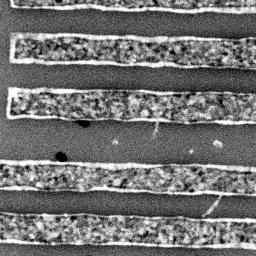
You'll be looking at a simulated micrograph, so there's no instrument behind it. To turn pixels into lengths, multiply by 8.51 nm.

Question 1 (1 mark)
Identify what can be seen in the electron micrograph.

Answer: groups of lines, slits or small figures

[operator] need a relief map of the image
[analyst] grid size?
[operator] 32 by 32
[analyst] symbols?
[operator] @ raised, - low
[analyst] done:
--@@@@@@@@@@@@@@@@@@@@@@@@@@@@@@
--------------------------------
--------------------------------
--------------------------------
-------@@@----------------------
--@@@@@@@@@@@@@@@@@@@@@@@@@@@@@@
--@@@@@@@@@@@@@@@@@@@@@@@@@@@@@@
--@@@@@@@@@@@@@@@@@@@@@@@@@@@@@@
--------------------------------
--------------------------------
--------------------------------
-@@@@@@@@@@@@@@@@@@-------------
-@@@@@@@@@@@@@@@@@@@@@@@@@@@@@@@
-@@@@@@@@@@@@@@@@@@@@@@@@@@@@@@@
-@@@@@@@@@@@@@@@@@@@@@@@@@@@@@@@
--------------------------------
--------------------------------
--------------------------------
--------------------------------
--------------------------------
@@-@@@@-------------------------
@@@@@@@@@@@@@@@@@@@@@@@@@@@@@@@@
@@@@@@@@@@@@@@@@@@@@@@@@@@@@@@@@
@@@@@@@@@@@@@@@@@@@@@@@@@@@@@@@@
--------------------------------
--------------------------------
--------------------------------
@@@@@@@@@@@@@@@@@@@@@@@@--------
@@@@@@@@@@@@@@@@@@@@@@@@@@@@@@@@
@@@@@@@@@@@@@@@@@@@@@@@@@@@@@@@@
------------@----@@@@@@@@@@@@@@@
--------------------------------